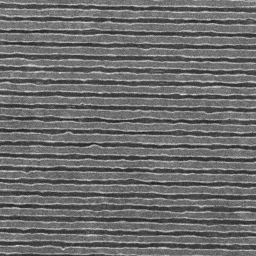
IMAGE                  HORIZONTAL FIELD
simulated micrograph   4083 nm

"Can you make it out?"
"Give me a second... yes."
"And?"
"parallel lines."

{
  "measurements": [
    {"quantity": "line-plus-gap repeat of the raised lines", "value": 199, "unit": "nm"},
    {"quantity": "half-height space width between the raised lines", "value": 71.8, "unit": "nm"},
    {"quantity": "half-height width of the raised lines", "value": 0.126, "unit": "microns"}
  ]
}